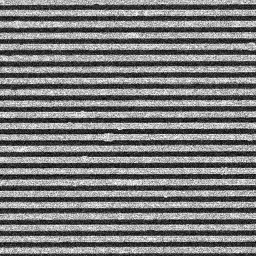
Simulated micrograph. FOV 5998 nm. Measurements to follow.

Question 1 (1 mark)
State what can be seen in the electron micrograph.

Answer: parallel lines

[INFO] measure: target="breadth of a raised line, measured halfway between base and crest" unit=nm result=138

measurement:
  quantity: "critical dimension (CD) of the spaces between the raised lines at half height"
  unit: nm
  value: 114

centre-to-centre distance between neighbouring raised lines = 264 nm